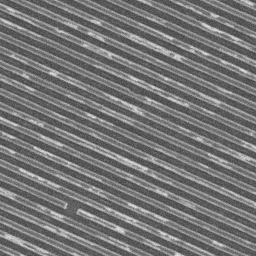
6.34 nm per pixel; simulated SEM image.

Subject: parallel lines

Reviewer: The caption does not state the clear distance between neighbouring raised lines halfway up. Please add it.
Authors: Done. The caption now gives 44.2 nm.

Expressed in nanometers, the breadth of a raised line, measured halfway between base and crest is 33.3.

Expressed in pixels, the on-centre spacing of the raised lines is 12.9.